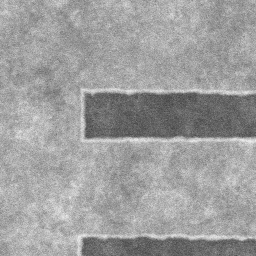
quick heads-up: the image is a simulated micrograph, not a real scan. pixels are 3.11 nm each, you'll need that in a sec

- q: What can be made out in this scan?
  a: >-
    one or a few lines or trenches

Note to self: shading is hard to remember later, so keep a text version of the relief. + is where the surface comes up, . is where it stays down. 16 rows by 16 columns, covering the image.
++++++++++++++++
++++++++++++++++
++++++++++++++++
++++++++++++++++
++++++++++++++++
++++++++++++++++
+++++...........
+++++...........
+++++...........
++++++++++++++++
++++++++++++++++
++++++++++++++++
++++++++++++++++
++++++++++++++++
++++++++++++++++
+++++...........